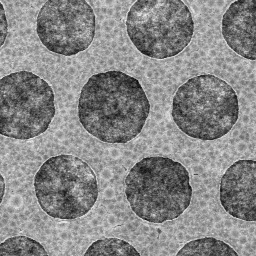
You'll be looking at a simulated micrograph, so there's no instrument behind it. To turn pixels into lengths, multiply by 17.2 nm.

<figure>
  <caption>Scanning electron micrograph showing holes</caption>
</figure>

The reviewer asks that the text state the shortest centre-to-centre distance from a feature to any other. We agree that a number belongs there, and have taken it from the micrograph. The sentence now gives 1590 nanometers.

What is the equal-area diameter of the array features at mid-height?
1150 nm